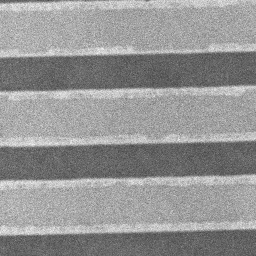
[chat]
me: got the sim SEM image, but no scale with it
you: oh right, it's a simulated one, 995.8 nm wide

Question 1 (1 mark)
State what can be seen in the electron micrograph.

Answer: one or a few lines or trenches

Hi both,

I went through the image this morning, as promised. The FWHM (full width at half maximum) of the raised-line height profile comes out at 203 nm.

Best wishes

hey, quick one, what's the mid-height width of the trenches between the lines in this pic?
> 0.146 micrometres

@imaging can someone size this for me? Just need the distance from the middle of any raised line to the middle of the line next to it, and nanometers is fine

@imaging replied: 346